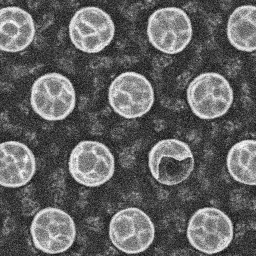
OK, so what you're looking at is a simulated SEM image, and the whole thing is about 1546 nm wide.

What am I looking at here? a regular array of raised bodies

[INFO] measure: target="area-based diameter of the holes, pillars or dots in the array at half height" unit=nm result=265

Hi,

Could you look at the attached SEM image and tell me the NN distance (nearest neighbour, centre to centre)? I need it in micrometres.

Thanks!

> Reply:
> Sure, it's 0.464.